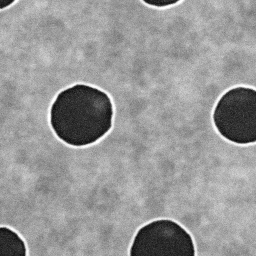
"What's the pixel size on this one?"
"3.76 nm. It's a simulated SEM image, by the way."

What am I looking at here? holes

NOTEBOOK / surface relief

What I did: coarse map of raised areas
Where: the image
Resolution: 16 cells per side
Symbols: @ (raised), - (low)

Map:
@@@@@@@@@@@@@@@@
@@@@@@@@@@@@@@@@
@@@@@@@@@@@@@@@@
@@@@@@@@@@@@@@@@
@@@@@@@@@@@@@@@@
@@@@--@@@@@@@@@-
@@@----@@@@@@@--
@@@----@@@@@@---
@@@@--@@@@@@@@--
@@@@@@@@@@@@@@@@
@@@@@@@@@@@@@@@@
@@@@@@@@@@@@@@@@
@@@@@@@@@@@@@@@@
@@@@@@@@@@@@@@@@
-@@@@@@@@---@@@@
--@@@@@@----@@@@